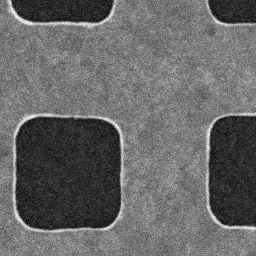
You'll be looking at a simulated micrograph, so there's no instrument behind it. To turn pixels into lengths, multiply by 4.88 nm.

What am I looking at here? holes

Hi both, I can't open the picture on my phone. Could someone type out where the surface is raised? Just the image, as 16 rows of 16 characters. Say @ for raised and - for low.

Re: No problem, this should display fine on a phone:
@------@@@@@@---
@@@@@-@@@@@@@@--
@@@@@@@@@@@@@@@@
@@@@@@@@@@@@@@@@
@@@@@@@@@@@@@@@@
@@@@@@@@@@@@@@@@
@@@@@@@@@@@@@@@@
@@-----@@@@@@@--
@-------@@@@@---
@-------@@@@@---
@-------@@@@@---
@-------@@@@@---
@-------@@@@@---
@------@@@@@@---
@@@@@@@@@@@@@@@@
@@@@@@@@@@@@@@@@